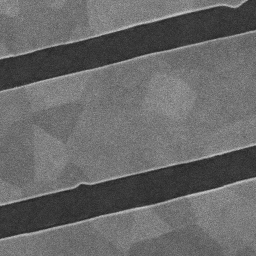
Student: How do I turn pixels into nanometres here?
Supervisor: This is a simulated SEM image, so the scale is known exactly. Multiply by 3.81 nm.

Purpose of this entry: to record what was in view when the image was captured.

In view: one or a few lines or trenches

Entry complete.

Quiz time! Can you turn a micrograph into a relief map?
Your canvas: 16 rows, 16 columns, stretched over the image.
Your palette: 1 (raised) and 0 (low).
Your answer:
1111111111111000
1111111110000000
1111100000000111
1000000001111111
0000011111111111
0111111111111111
1111111111111111
1111111111111111
1111111111111111
1111111111111100
1111111111000000
1111100000000001
1000000000011111
0000001111111111
0011111111111111
1111111111111111